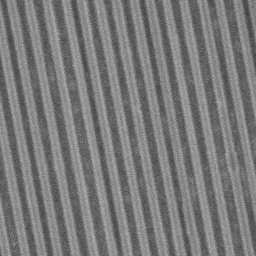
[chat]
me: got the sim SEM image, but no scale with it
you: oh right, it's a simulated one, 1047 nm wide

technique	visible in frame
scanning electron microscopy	parallel lines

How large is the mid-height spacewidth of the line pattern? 39.7 nm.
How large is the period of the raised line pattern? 0.0694 microns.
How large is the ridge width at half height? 32.7 nm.